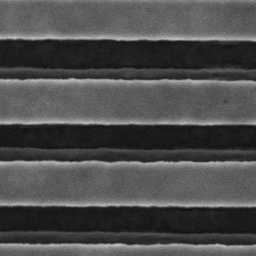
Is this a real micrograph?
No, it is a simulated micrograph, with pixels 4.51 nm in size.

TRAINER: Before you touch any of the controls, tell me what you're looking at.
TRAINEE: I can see lines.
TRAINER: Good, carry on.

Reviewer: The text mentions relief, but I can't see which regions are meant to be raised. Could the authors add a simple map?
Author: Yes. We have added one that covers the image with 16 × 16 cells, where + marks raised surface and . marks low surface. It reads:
++++++++++++++++
++++++++++++++++
...............+
................
................
++++++++++++++++
++++++++++++++++
++++++++++++++++
................
................
++++++++++++++++
++++++++++++++++
++++++++++++++++
................
................
++++++++++++++++